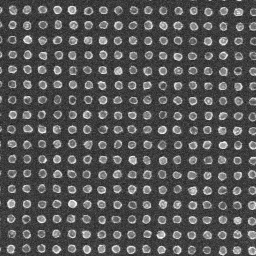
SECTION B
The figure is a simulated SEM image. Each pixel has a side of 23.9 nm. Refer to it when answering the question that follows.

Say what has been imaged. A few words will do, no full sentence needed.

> a regular array of raised bodies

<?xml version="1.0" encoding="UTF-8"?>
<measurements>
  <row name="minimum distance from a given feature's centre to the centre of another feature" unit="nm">343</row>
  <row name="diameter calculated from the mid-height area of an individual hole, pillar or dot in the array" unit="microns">0.181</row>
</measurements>